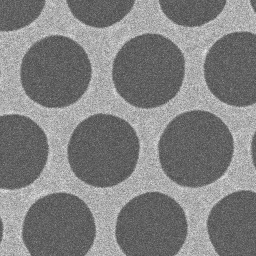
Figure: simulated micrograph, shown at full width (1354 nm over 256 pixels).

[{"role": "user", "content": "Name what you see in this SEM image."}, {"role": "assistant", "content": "holes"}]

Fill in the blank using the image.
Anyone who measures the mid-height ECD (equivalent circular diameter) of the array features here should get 0.39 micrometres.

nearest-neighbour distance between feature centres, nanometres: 483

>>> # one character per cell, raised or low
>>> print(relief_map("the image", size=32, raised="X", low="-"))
------XX---------XXX--------XXX-
-----XXXX-------XXXX--------XXXX
----XXXXXX-----XXXXXX------XXXXX
---XXXXXXXXX-XXXXXXXXXXXXXXXXXXX
XXXXXX--XXXXXXXXX---XXXXXXXX----
XXXX------XXXXXX------XXXXX-----
XXX--------XXXX--------XXX------
XXX--------XXX---------XXX------
XXX--------XXX---------XX-------
XXX--------XXX---------XXX------
XXX--------XXX---------XXX------
XXX--------XXXX-------XXXX------
XXXX------XXXXXX-----XXXXXX-----
XXXXXX--XXXXXXXXXX-XXXXXXXXXXXXX
---XXXXXXXX---XXXXXXXX-----XXXXX
-----XXXXX------XXXXX-------XXXX
------XXX--------XXX---------XXX
------XXX--------XXX---------XX-
------XX----------XX---------XX-
------XX---------XXX---------XX-
------XXX--------XXX---------XXX
-----XXXX--------XXX--------XXXX
-----XXXXX------XXXXX------XXXXX
---XXXXXXXXXXXXXXXXXXXXXXXXXXXXX
XXXXXX---XXXXXXXX----XXXXXXX----
XXXX-------XXXXX------XXXXX-----
XXX--------XXXX--------XXX------
XXX---------XXX--------XXX------
XXX---------XX---------XXX------
XXX---------XX---------XXX------
XXX---------XXX--------XXXX-----
XXXX-------XXXX-------XXXXX-----